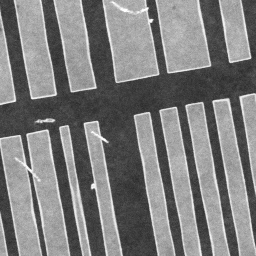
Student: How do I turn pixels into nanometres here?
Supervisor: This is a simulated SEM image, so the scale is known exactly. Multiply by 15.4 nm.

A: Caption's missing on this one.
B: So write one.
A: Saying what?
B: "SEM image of groups of lines, slits or small figures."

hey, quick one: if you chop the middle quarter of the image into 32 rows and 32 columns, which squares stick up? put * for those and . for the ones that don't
.******......**********...******
.******......**********...*****.
.******......**********.........
.******......*******............
.*******........................
..******........................
..***...........................
................................
................................
................................
...............................*
.........................***...*
...................**...****...*
..................****..*****..*
.......*..........****...****..*
.....****.........****...****..*
*....****.........****...****...
**....***.........****...****...
**....****........*****..*****..
**....***..........****...****..
**....****.........****...****..
**....****.........****...****..
**.....***.........****...****..
**.....***..........***...****..
.*.....***..........***...****..
.**....***..........****..*****.
.**....****.........****...****.
.**....****.........****...****.
.**....****.........****...****.
..*.....***.........*****..****.
..*....****..........****..*****
..**....***..........****...****